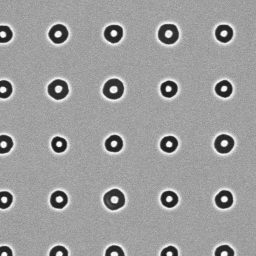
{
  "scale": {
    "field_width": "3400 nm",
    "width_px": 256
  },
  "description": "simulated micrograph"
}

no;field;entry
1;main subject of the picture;a regular array of ring-shaped grooves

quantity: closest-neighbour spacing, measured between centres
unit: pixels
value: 54.9